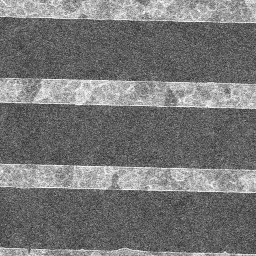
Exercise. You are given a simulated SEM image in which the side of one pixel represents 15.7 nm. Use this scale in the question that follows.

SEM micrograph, one or a few lines or trenches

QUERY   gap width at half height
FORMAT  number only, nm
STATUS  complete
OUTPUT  969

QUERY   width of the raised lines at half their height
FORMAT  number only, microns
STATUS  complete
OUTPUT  0.35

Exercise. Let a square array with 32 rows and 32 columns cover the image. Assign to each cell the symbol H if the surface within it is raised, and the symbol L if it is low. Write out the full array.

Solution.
HHHHHHHHHHHHHHHHHHHHHHHHHHHHHHHH
HHHHHHHHHHHHHHHHHHHHHHHHHHHHHHHH
LLLLLLLLLLLLLLLLLLLHHHHHHHHHHHHH
LLLLLLLLLLLLLLLLLLLLLLLLLLLLLLLL
LLLLLLLLLLLLLLLLLLLLLLLLLLLLLLLL
LLLLLLLLLLLLLLLLLLLLLLLLLLLLLLLL
LLLLLLLLLLLLLLLLLLLLLLLLLLLLLLLL
LLLLLLLLLLLLLLLLLLLLLLLLLLLLLLLL
LLLLLLLLLLLLLLLLLLLLLLLLLLLLLLLL
LLLLLLLLLLLLLLLLLLLLLLLLLLLLLLLL
HHHHHHHHLHHHHHHHHHHHHHHHHHHHHHLL
HHLHHHHHHHHHHHHHHHHHHHHHHHHHHHHH
HHHHHHHHHHHHHHHHHHHHHHHHHHHHHHHH
LLLLLLLLLLLLLLLLLLLLLLLLLLLLLLLL
LLLLLLLLLLLLLLLLLLLLLLLLLLLLLLLL
LLLLLLLLLLLLLLLLLLLLLLLLLLLLLLLL
LLLLLLLLLLLLLLLLLLLLLLLLLLLLLLLL
LLLLLLLLLLLLLLLLLLLLLLLLLLLLLLLL
LLLLLLLLLLLLLLLLLLLLLLLLLLLLLLLL
LLLLLLLLLLLLLLLLLLLLLLLLLLLLLLLL
LLLLLLLLLLLLLLLLLLLLLLLLLLLLLLLL
HHHHHHHHHHHHHHHHHHHHHHHHHHHHHHHH
HHHHHHHHHHHHHHHHHHHHHHHHHHHHHHHH
LLLLLLLLLLHHHHHHHHHHHHHHHHHHHHHH
LLLLLLLLLLLLLLLLLLLLLLLLLLLLLLLL
LLLLLLLLLLLLLLLLLLLLLLLLLLLLLLLL
LLLLLLLLLLLLLLLLLLLLLLLLLLLLLLLL
LLLLLLLLLLLLLLLLLLLLLLLLLLLLLLLL
LLLLLLLLLLLLLLLLLLLLLLLLLLLLLLLL
LLLLLLLLLLLLLLLLLLLLLLLLLLLLLLLL
LLLLLLLLLLLLLLLLLLLLLLLLLLLLLLLL
HHHHHHHHHHHHHHHHHHLLLLLLLLLLLLLL